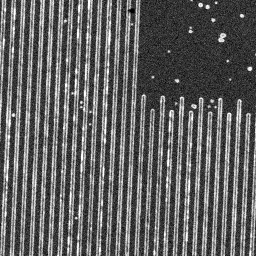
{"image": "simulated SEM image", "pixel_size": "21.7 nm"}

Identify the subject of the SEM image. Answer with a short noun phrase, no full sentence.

parallel lines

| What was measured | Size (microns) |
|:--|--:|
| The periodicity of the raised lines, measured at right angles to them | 0.208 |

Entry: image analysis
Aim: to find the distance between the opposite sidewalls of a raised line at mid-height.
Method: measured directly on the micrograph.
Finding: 78.7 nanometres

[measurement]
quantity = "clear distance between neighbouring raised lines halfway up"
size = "130 nm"